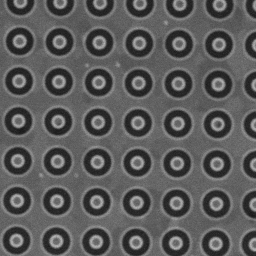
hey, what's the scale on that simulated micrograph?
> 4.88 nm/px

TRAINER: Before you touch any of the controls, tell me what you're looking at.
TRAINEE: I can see an array of small figures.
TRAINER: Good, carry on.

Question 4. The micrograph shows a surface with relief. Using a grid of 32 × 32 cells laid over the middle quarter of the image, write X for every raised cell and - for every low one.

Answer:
XXXXXXXXXXXXXXXXXXXXXXXXXXXXXXXX
-XXXXXX----XXXXXX---XXXXXXX---XX
--XXXX------XXXX------XXXX-----X
--XXX---XX--XXX---X---XXX-------
---XX--XXX--XXX--XXX--XXX--XXX--
--XXX---XX--XXX--XXX--XXX--XXX--
--XXXX------XXX-------XXX-------
-XXXXX-----XXXXX-----XXXXX-----X
XXXXXXXXXXXXXXXXXX-XXXXXXXX---XX
XXXXXXXXXXXXXXXXXXXXXXXXXXXXXXXX
XXXXXXXXXXXXXXXXXXXXXXXXXXXXXXXX
-XXXXX-----XXXXXX---XXXXXXX---XX
--XXX-------XXXX-----XXXXX-----X
--XXX---X---XXX---X---XXX---X---
--XXX--XXX--XXX--XXX--XXX--XXX--
--XXX--XXX--XXX--XXX--XXX--XXX--
--XXX-------XXX-------XXX-------
-XXXXX-----XXXXX-----XXXXX-----X
XXXXXXXXXXXXXXXXXXXXXXXXXXXX-XXX
XXXXXXXXXXXXXXXXXXXXXXXXXXXXXXXX
XXXXXXXXXXXXXXXXXXXXXXXXXXXXXXXX
-XXXXX----XXXXXX----XXXXXXX---XX
--XXX-------XXX------XXXX------X
--XXX--XX---XXX---X---XXX-------
--XXX--XXX--XXX--XXX--XXX--XXX--
--XXX--XXX--XXX--XXX--XXX--XXX--
-XXXX------XXXX-------XXX-------
XXXXXX-----XXXXX-----XXXXX-----X
XXXXXXXXXXXXXXXXXX-XXXXXXXXX-XXX
XXXXXXXXXXXXXXXXXXXXXXXXXXXXXXXX
XXXXXXXXXXXXXXXXXXXXXXXXXXXXXXXX
-XXXXX----XXXXXX----XXXXXX----XX